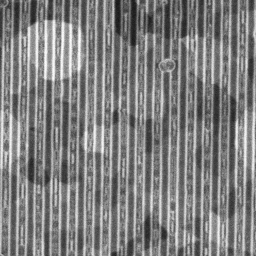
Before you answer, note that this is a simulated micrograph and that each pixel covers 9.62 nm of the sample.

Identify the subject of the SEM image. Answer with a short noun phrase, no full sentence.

parallel lines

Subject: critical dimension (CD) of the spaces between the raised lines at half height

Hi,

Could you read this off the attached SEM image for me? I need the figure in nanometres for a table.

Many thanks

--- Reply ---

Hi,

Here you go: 75.8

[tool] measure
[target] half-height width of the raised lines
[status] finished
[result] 8.75 pixels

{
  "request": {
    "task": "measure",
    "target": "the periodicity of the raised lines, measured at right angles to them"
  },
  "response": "161 nanometres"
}